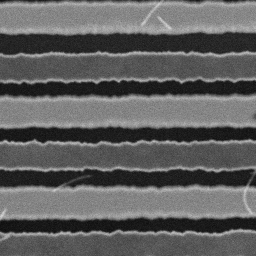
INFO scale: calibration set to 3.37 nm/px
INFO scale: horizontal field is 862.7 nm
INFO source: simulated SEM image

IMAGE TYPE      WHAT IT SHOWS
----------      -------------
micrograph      lines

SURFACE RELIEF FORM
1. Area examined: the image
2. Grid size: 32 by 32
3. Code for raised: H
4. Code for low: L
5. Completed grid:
HHHHHHHHHHHHHHHHHHHHHHHHHHHHHHHH
HHHHHHHHHHHHHHHHHHHHHHHHHHHHHHHH
HHHHHHHHHHHHHHHHHHHHHHHHHHHHHHHH
HHHHHHHHHHHHHHHHHHHHHHHHHHHHHHHH
LLLLLLLLLLLLLLLLLLLLLLLLLLLLLLLL
LLLLLLLLLLLLLLLLLLLLLLLLLLLLLLLL
LLLLLLLLLLLLHLLLHHLLLHHLLLLLLLHL
HHHHHHHHHHHHHHHHHHHHHHHHHHHHHHHH
HHHHHHHHHHHHHHHHHHHHHHHHHHHHHHHH
HHHHHHHHHHHHHHHHHHHHHHHHHHHHHHHH
LLLLLLLLLLLLLLLLLLLLLLLLLLLLLLLL
LLLLLLLLLLLLLLLLLLLLLLLLLLLLLLLL
HHHHHHHHHHHHHHHHHHHHHHHHHHHHHHHH
HHHHHHHHHHHHHHHHHHHHHHHHHHHHHHHH
HHHHHHHHHHHHHHHHHHHHHHHHHHHHHHHH
HHHHHHHHHHHHHHHHHHHHHHHHHHHHHHHH
LLLLLLLLLLLLLLLLLLLLLLLLLLLLLLLL
LLLLLLLLLLLLLLLLLLLLLLLLLLLLLLLL
HHHHHHHHHHHHHHHHHHHHHHHHHHHHHHHH
HHHHHHHHHHHHHHHHHHHHHHHHHHHHHHHH
HHHHHHHHHHHHHHHHHHHHHHHHHHHHHHHH
LLLLLLLLLLLLLLLLLLLLLLLLLLLLLLLL
LLLLLLLLLLLLLLLLLLLLLLLLLLLLLLLL
LLHHHHLHLHHHHLHHHLHLLHHHHHHHHLHH
HHHHHHHHHHHHHHHHHHHHHHHHHHHHHHHH
HHHHHHHHHHHHHHHHHHHHHHHHHHHHHHHH
HHHHHHHHHHHHHHHHHHHHHHHHHHHHHHHH
LLLLLLLLLLLLLLLLLLLLLLLLLLLLLLLL
LLLLLLLLLLLLLLLLLLLLLLLLLLLLLLLL
HHHHHHHHHHHHHHHHHHHHHHHHHHHHHHHH
HHHHHHHHHHHHHHHHHHHHHHHHHHHHHHHH
HHHHHHHHHHHHHHHHHHHHHHHHHHHHHHHH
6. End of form